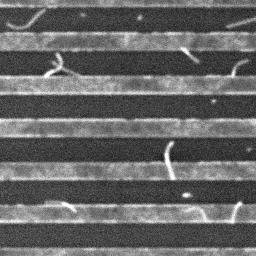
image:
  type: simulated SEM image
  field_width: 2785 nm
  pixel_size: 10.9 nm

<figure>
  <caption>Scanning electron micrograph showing lines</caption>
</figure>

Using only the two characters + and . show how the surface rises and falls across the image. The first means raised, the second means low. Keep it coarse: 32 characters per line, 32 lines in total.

++++++++++++++++++++++++++++++++
................................
................................
................................
++++++++++++++++++++++++++++++++
++++++++++++++++++++++++++++++++
................................
................................
................................
.....++......................+..
++++++++++++++++++++++++++++++++
++++++++++++++++++++++++++++++++
................................
................................
................................
++++++++++++++++++++++++++++++++
++++++++++++++++++++++++++++++++
................................
................................
................................
++++++++++++++++++++++++++++++++
++++++++++++++++++++++++++++++++
................................
................................
................................
................................
++++++++++++++++++++++++++++++++
++++++++++++++++++++++++++++++++
................................
................................
................................
++++++++++++++++++++++++++++++++